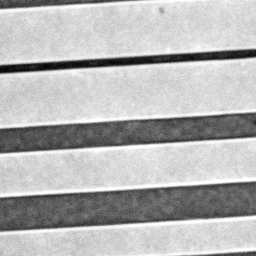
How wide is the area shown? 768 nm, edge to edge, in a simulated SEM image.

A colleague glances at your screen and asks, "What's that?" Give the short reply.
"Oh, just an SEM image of one or a few lines or trenches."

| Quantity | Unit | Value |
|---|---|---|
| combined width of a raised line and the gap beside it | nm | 213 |